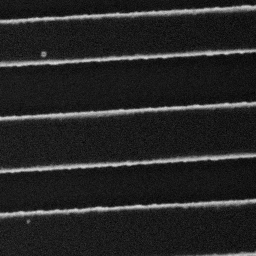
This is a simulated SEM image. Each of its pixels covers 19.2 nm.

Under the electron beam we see lines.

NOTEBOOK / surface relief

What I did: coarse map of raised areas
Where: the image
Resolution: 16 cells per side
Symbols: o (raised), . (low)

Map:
...............o
oooooooooooooooo
oooooooooooooooo
oooooooooo......
................
................
...............o
oooooooooooooooo
oooooooooooooooo
oooooooooooooooo
ooo.............
................
................
oooooooooooooooo
oooooooooooooooo
oooooooooooooooo